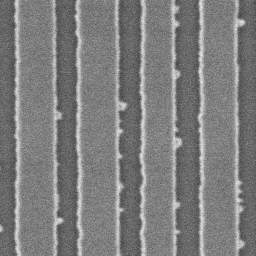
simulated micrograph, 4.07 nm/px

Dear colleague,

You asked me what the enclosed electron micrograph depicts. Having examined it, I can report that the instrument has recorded lines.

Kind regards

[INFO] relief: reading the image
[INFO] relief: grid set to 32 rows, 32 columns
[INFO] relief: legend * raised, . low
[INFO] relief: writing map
..*****...*****...****...*****..
..*****...*****...****...*****..
..*****...*****...****...*****..
..*****...*****...****...*****..
..*****...*****...****...*****..
..*****...*****...****...*****..
..*****...*****...****...*****..
..*****...*****...****...*****..
..*****...*****...****...*****..
..*****...*****...****...*****..
..*****...*****...****...*****..
..*****...*****...****...*****..
..*****...*****...****...*****..
..*****...*****...****...*****..
..*****...*****...****...*****..
..*****...*****...****...*****..
..*****...*****...****...*****..
..*****...*****...****...*****..
..*****...*****...****...*****..
..*****...*****...****...*****..
..*****...*****...****...*****..
..*****...*****...****...*****..
..*****...*****...****...*****..
..*****...*****...****...*****..
..*****...*****...****...*****..
..*****...*****...****...*****..
..*****...*****...****...*****..
..*****...*****...****...*****..
..*****...*****...****...*****..
..*****...*****...****...*****..
..*****...*****...****...*****..
..*****...*****...****...*****..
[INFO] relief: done